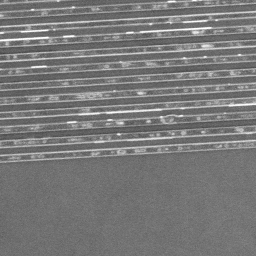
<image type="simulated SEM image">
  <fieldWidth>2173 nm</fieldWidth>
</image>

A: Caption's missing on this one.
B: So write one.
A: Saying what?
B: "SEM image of parallel lines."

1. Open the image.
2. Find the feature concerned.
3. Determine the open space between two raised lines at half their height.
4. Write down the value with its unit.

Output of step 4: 66.7 nm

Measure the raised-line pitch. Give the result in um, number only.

0.122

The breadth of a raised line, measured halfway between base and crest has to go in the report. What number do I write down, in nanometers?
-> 58.2